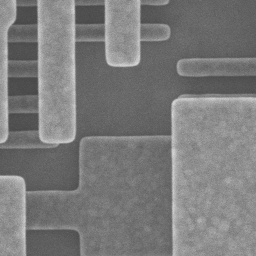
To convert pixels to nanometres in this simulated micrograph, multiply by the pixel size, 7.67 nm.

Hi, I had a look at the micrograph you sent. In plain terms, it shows wiring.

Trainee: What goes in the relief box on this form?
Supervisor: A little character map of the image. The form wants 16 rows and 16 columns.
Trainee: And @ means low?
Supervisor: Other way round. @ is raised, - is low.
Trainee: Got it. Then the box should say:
@-@@@--@@-------
@-@@@--@@-------
--@@@--@@-------
--@@@--@@-------
--@@@-----------
--@@@-----------
--@@@------@@@@@
--@@@------@@@@@
---@@------@@@@@
-----------@@@@@
-----------@@@@@
@@---------@@@@@
@@---------@@@@@
@@---------@@@@@
@@---------@@@@@
@@---------@@@@@